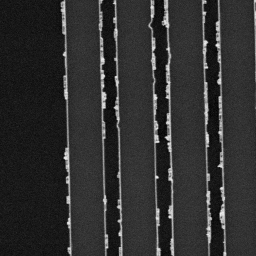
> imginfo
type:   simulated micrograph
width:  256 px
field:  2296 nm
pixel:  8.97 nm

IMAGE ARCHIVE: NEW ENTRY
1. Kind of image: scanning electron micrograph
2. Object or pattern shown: parallel lines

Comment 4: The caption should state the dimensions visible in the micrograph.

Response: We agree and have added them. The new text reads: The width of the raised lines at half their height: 0.148 micrometres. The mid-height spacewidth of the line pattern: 312 nanometres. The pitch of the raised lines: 51.6 px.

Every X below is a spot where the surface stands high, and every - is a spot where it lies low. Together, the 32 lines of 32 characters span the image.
XXXXXXXX----XX-----XX----XX-----
XXXXXXXX----XX-----XX----XX-----
XXXXXXXX-----X-----XX----XX-----
XXXXXXXX----XXX----XX----XX-----
XXXXXXXX-----XX----XX----XX-----
XXXXXXXX-----XX----XX-----X-----
XXXXXXXX-----XX----XX----XX-----
XXXXXXXX-----XX----XX-----XX----
XXXXXXXX-----XX----XX-----XX----
XXXXXXXX-----XX----XX-----XX----
XXXXXXXX-----XX----XX-----XX----
XXXXXXXX-----XX----XX-----XX----
XXXXXXXX-----XX----XX-----XX----
XXXXXXXX-----XX----XX-----XX----
XXXXXXXX-----XX----XX-----XX----
XXXXXXXX-----XX----XX-----XX----
XXXXXXXX-----XX----XX-----XX----
XXXXXXXXX----XX----XX-----XX----
XXXXXXXXX----XX----XX-----XX----
XXXXXXXX-----XX----XX-----XX----
XXXXXXXXX----XX----XX-----XX----
XXXXXXXXX----XX----XX-----XX----
XXXXXXXXX----XX----XX-----XX----
XXXXXXXXX----XX----XXX----XX----
XXXXXXXXX----XX----XXX----XX----
XXXXXXXXX----XX----XXX----XX----
XXXXXXXXX----XX-----XX----XX----
XXXXXXXXX----XX-----XX----XX----
XXXXXXXXX----XX-----XX----XX----
XXXXXXXXX----XX-----XX----XX----
XXXXXXXXX----XX-----XX----XX----
XXXXXXXXX----XX-----XX----XX----